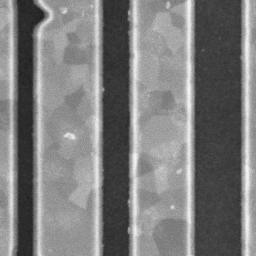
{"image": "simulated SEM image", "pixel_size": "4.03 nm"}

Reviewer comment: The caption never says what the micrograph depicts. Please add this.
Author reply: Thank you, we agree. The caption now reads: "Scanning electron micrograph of one or a few lines or trenches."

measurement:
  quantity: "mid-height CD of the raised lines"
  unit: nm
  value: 223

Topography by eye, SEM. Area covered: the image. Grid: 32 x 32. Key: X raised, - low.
X----XXXXXXX-----XXXXXXX-------X
XX----XXXXXX-----XXXXXXX-------X
XX----XXXXXX-----XXXXXXX-------X
X----XXXXXXX-----XXXXXXX-------X
XX---XXXXXXX-----XXXXXXX-------X
XX---XXXXXXX-----XXXXXXX-------X
XX---XXXXXXX-----XXXXXXX-------X
XX---XXXXXXX-----XXXXXXX-------X
XX---XXXXXXX-----XXXXXXX-------X
XX---XXXXXXX-----XXXXXXX-------X
XX---XXXXXXX-----XXXXXXX-------X
XX---XXXXXXX-----XXXXXXX-------X
XX---XXXXXXX-----XXXXXXX-------X
XX---XXXXXXX-----XXXXXXX-------X
XX---XXXXXXX-----XXXXXXX-------X
XX---XXXXXXX-----XXXXXXX-------X
XX---XXXXXXX-----XXXXXXX-------X
X----XXXXXXX-----XXXXXXX-------X
XX---XXXXXXX-----XXXXXXX-------X
XX---XXXXXXX-----XXXXXXX-------X
XX---XXXXXXX-----XXXXXXX-------X
XX---XXXXXXX-----XXXXXXX-------X
XX---XXXXXXX-----XXXXXXX-------X
XX---XXXXXXX-----XXXXXXX-------X
XX---XXXXXXX-----XXXXXXX-------X
XX---XXXXXXX-----XXXXXXX-------X
XX---XXXXXXX-----XXXXXXX-------X
XX---XXXXXXX-----XXXXXXX-------X
XX---XXXXXXX-----XXXXXXX-------X
XX---XXXXXXX-----XXXXXXX-------X
X----XXXXXXX-----XXXXXXX-------X
X----XXXXXXX-----XXXXXXX-------X